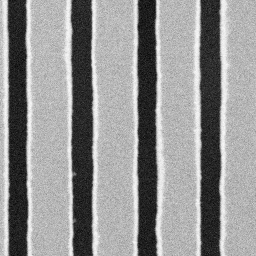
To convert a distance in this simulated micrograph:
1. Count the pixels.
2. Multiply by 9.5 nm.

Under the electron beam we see lines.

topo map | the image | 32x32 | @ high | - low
@--@@@@@@---@@@@@---@@@@@---@@@@
@--@@@@@@---@@@@@---@@@@@---@@@@
@--@@@@@@---@@@@@--@@@@@@---@@@@
@--@@@@@@---@@@@@--@@@@@@---@@@@
@--@@@@@@---@@@@@--@@@@@@---@@@@
@--@@@@@@--@@@@@@---@@@@@---@@@@
@--@@@@@@--@@@@@@---@@@@@---@@@@
@--@@@@@@--@@@@@@---@@@@@---@@@@
@--@@@@@@--@@@@@@---@@@@@---@@@@
@--@@@@@@---@@@@@---@@@@@---@@@@
@--@@@@@@---@@@@@---@@@@@---@@@@
@--@@@@@@---@@@@@---@@@@@---@@@@
@--@@@@@@---@@@@@---@@@@@---@@@@
@--@@@@@@---@@@@@---@@@@@---@@@@
@--@@@@@@---@@@@@---@@@@@---@@@@
@--@@@@@@---@@@@@---@@@@@---@@@@
@--@@@@@@---@@@@@---@@@@@---@@@@
@--@@@@@@---@@@@@---@@@@@---@@@@
@--@@@@@@---@@@@@---@@@@@---@@@@
@--@@@@@@---@@@@@---@@@@@---@@@@
@--@@@@@@---@@@@@---@@@@@---@@@@
@--@@@@@@---@@@@@---@@@@@---@@@@
@--@@@@@@---@@@@@---@@@@@---@@@@
@--@@@@@@---@@@@@---@@@@@--@@@@@
@--@@@@@@---@@@@@---@@@@@---@@@@
@---@@@@@---@@@@@---@@@@@---@@@@
@---@@@@@---@@@@@---@@@@@---@@@@
@--@@@@@@---@@@@@---@@@@@---@@@@
@--@@@@@@---@@@@@--@@@@@@---@@@@
@--@@@@@@---@@@@@---@@@@@---@@@@
@--@@@@@@---@@@@@---@@@@@--@@@@@
@---@@@@@---@@@@@---@@@@@---@@@@